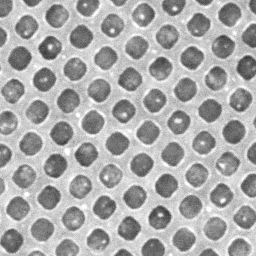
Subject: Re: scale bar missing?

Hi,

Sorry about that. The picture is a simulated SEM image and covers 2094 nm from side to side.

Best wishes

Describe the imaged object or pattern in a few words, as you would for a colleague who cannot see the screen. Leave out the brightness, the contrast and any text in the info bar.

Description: a regular array of holes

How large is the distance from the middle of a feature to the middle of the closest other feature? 263 nm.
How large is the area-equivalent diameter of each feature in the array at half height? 0.199 um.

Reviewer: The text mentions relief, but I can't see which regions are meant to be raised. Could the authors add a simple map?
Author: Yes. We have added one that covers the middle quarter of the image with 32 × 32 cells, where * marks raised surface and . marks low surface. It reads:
......**....*********......***..
......***..****...***......****.
.....*********.....**......*****
*....***..****......**....***..*
*******....**.......********....
******......**.....*********....
...***......***...****..***.....
...***......*********....**.....
....***....*********......**....
....****..***....***......***..*
....********......**.....*******
...****.****......***...****..**
*****....***......*********....*
*****.....***....*********......
.***......****..****...***......
..**......*********.....**.....*
...**....*********......**.....*
...***..****...***......***...**
..*********.....**.....*********
.****..***.......**....****.****
****....**......*********....***
***......**.....*********.....**
***......***...***...***......**
***.....*********.....**......**
.**.....********.......**....***
.***...***...***......****..****
.********.....***.....*********.
*********......**....****..***..
**....***......*********....**..
*......**.....*********.....***.
*......***...****..****......***
*......*********....***.....****